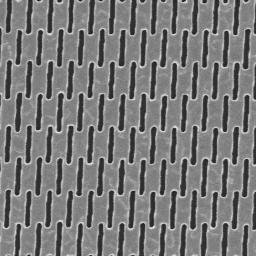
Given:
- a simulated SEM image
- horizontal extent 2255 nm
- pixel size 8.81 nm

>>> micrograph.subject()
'a regular array of holes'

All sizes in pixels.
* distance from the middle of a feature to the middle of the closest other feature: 20.7